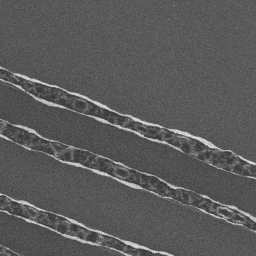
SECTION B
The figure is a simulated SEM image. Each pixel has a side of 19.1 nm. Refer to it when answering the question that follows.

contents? parallel lines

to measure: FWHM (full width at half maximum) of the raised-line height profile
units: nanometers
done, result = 298